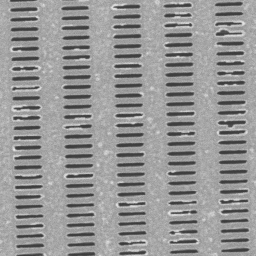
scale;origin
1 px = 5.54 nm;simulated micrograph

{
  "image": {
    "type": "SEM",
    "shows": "a regular array of holes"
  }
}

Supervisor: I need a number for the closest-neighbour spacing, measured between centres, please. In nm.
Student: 54.4